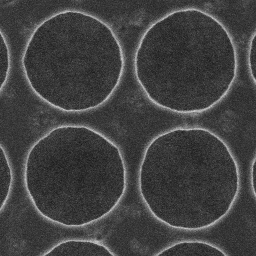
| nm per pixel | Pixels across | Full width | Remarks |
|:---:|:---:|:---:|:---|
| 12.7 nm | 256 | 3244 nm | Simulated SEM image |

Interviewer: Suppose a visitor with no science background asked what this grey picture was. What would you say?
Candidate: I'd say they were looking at holes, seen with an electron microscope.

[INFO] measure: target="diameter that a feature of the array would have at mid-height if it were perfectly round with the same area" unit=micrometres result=1.24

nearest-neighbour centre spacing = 1440 nanometres